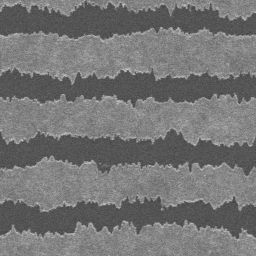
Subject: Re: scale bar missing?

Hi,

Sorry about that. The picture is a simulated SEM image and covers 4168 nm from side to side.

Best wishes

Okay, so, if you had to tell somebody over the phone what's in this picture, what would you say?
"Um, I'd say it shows one or a few lines or trenches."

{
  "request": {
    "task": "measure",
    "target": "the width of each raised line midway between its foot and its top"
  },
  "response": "629 nm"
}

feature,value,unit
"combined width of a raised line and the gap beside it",1060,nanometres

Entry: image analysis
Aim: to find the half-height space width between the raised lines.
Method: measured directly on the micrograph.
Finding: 26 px